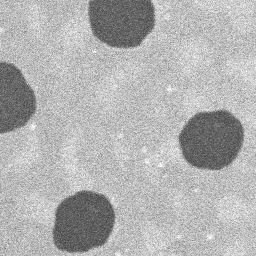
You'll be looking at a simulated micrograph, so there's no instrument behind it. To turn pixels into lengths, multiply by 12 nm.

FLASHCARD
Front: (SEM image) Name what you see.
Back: holes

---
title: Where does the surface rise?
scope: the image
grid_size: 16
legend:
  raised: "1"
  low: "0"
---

1111110000111111
1111110000111111
1111110001111111
1111111111111111
0111111111111111
0011111111111111
0011111111111111
0011111111110001
1111111111100001
1111111111100001
1111111111110011
1111111111111111
1111000111111111
1110000111111111
1110000111111111
1111001111111111